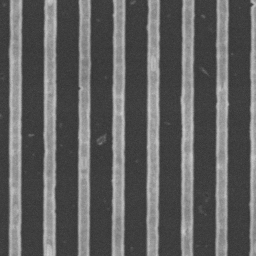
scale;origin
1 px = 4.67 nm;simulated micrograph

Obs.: parallel lines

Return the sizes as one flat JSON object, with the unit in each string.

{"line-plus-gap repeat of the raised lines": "161 nm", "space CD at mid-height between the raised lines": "114 nanometers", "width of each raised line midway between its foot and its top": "47.3 nm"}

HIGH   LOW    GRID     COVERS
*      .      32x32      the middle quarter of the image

....**.......**......**.......**
....**.......**......**.......**
....**.......**......**.......**
....**.......**......**.......**
....**.......**......**.......**
....**.......**......**.......**
....**.......**......**.......**
....**.......**......**.......**
....**.......**......**.......**
....**......***......**.......**
....**.......**......**.......**
....**.......**......**.......**
....**.......**......**.......**
....**......***......***......**
....**......***......***......**
....**......***......**.......**
....**......***......**.......**
....**......***......**.......**
....**......***......**.......**
....**......***......**.......**
....**......***......**.......**
....**......***......**.......**
....**.......**......**.......**
....**.......**......**.......**
....**.......**......**.......**
....**......***......**.......**
....**......***......**.......**
....**......***......**.......**
....**......***......**.......**
....**......***......**.......**
....**......***......**.......**
....**.......**......**.......**